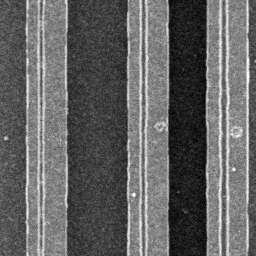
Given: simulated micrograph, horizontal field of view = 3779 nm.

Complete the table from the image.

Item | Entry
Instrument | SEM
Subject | lines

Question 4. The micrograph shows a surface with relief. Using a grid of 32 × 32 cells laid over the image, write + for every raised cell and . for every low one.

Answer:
...+++++........+++++.....+++++.
...+++++........+++++.....+++++.
...+++++........+++++.....+++++.
...+++++........+++++.....+++++.
...+++++........+++++.....+++++.
...+++++........+++++.....+++++.
...+++++........+++++.....+++++.
...+++++........+++++.....+++++.
...+++++........+++++.....+++++.
...+++++........+++++.....+++++.
....++++........+++++.....+++++.
...+++++........+++++.....+++++.
....++++........+++++.....+++++.
...+++++........+++++.....+++++.
...+++++........+++++.....+++++.
...+++++........+++++.....+++++.
...+++++........+++++.....+++++.
...+++++........+++++.....+++++.
...+++++........+++++.....+++++.
...+++++........+++++.....+++++.
...+++++........+++++.....+++++.
...+++++........+++++.....+++++.
...+++++........+++++.....+++++.
...+++++........+++++.....+++++.
...+++++........+++++.....+++++.
...+++++........+++++.....+++++.
...+++++........+++++.....+++++.
...+++++........+++++.....+++++.
...+++++........+++++.....+++++.
...+++++........+++++.....+++++.
...+++++........+++++.....+++++.
...+++++........+++++.....+++++.